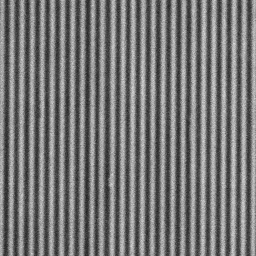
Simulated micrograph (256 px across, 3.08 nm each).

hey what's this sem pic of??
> parallel lines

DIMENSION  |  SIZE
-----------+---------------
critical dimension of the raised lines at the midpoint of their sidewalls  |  3.73 pixels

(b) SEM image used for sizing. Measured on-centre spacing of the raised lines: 31.1 nm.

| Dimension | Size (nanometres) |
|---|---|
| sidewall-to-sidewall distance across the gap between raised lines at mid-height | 19.6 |